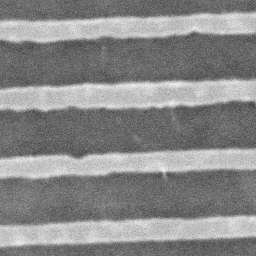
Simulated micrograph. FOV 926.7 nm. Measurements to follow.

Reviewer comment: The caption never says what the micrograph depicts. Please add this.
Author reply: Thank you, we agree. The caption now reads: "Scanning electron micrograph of one or a few lines or trenches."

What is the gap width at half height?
0.172 micrometres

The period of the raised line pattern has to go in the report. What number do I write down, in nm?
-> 246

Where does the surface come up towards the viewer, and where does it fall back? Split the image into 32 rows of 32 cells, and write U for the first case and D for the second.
DDDDDDDDDDDDDDDDDDDDDDDDDDDDDDDD
DDDDDDDDDDDDDDDDDDDDDDDDDDDDDDDD
DDDDDDDDDDDDUUUUUUUUUUUUUUUUUUUU
UUUUUUUUUUUUUUUUUUUUUUUUUUUUUUUU
UUUUUUUUUUUUUDUUUUUDDDDDDDDDDDDD
DDDDDDDDDDDDDDDDDDDDDDDDDDDDDDDD
DDDDDDDDDDDDDDDDDDDDDDDDDDDDDDDD
DDDDDDDDDDDDDDDDDDDDDDDDDDDDDDDD
DDDDDDDDDDDDDDDDDDDDDDDDDDDDDDDD
DDDDDDDDDDDDDDDDDDDDDDDDDDDDDDDD
DDDDDDDDDDDDDDDDDDUUUUUUUUUUUUUU
UUUUUUUUUUUUUUUUUUUUUUUUUUUUUUUU
UUUUUUUUUUUUUUUUUUUUUUUUUUUUUDDU
UUUUUUUUDDDDDDDDDDDDDDDDDDDDDDDD
DDDDDDDDDDDDDDDDDDDDDDDDDDDDDDDD
DDDDDDDDDDDDDDDDDDDDDDDDDDDDDDDD
DDDDDDDDDDDDDDDDDDDDDDDDDDDDDDDD
DDDDDDDDDDDDDDDDDDDDDDDDDDDDDDDD
DDDDDDDDDDDDDDDDDDDDDDDDDDDDDDDD
DDDDDDDDDDDUUUUUUUUUUUUUUUUUUUUU
UUUUUUUUUUUUUUUUUUUUUUUUUUUUUUUU
UUUUUUUUUUUUUUDDDDDDDDDDDDDDDDDD
DDDDDDDDDDDDDDDDDDDDDDDDDDDDDDDD
DDDDDDDDDDDDDDDDDDDDDDDDDDDDDDDD
DDDDDDDDDDDDDDDDDDDDDDDDDDDDDDDD
DDDDDDDDDDDDDDDDDDDDDDDDDDDDDDDD
DDDDDDDDDDDDDDDDDDDDDDDDDDDDDDDD
DDDDDDDDDDDDDDDDDDDUUUUDDUUUUUUU
UUUUUUUUUUUUUUUUUUUUUUUUUUUUUUUU
UUUUUUUUUUUUUUUUUUUUUUUUUUUUUUUD
UUUDDDDDDDDDDDDDDDDDDDDDDDDDDDDD
DDDDDDDDDDDDDDDDDDDDDDDDDDDDDDDD